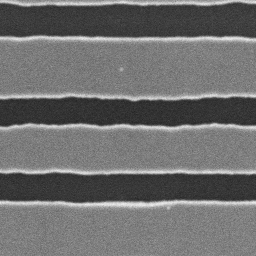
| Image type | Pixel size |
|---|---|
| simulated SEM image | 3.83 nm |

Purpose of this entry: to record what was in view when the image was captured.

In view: lines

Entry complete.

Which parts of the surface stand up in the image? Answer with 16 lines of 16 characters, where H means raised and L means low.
LLLLLLLLLLLLLLLL
LLLLLLLLLLLLLLLL
HHHHHHHHHHHHHHHH
HHHHHHHHHHHHHHHH
HHHHHHHHHHHHHHHH
HHHHHHHHHHHHHHHH
LLLLLLLLLLLLLLLL
LLLLLLLLLLLLLLLL
HHHHHHHHHHHHHHHH
HHHHHHHHHHHHHHHH
HHHHHHHHHHHHHHHH
LLLLLLLLLLLLLLLL
LLLLLLLLLLLLLLLL
HHHHHHHHHHHHHHHH
HHHHHHHHHHHHHHHH
HHHHHHHHHHHHHHHH